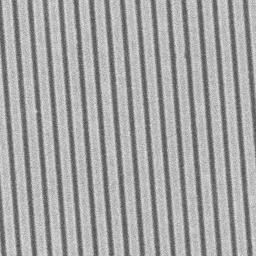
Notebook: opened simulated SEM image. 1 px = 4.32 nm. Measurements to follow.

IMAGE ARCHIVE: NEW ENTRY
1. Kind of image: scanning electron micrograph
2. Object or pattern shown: parallel lines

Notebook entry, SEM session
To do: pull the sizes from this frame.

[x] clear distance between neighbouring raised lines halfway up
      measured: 0.0269 micrometres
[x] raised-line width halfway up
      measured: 8.84 px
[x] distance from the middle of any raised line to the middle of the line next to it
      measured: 66.3 nanometres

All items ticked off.